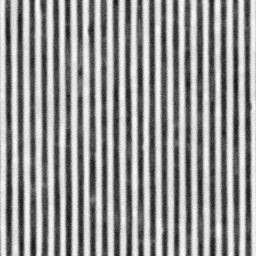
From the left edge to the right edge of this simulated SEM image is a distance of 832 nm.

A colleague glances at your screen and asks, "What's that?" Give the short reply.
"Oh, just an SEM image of parallel lines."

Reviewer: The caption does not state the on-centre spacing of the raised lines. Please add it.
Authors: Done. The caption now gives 38.9 nm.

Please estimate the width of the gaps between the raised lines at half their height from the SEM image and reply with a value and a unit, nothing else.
0.0256 µm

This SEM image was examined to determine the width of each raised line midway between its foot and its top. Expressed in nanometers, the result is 14.2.